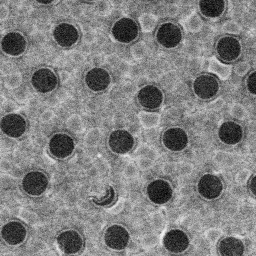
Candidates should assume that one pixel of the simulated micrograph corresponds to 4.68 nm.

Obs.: a regular array of raised bodies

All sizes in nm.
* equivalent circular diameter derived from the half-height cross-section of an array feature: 125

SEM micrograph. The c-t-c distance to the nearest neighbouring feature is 0.229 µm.